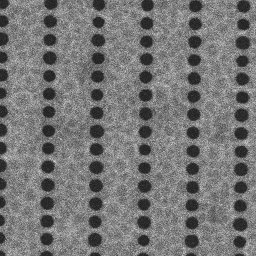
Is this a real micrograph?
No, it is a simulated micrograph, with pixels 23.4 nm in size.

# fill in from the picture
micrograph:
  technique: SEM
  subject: a regular array of holes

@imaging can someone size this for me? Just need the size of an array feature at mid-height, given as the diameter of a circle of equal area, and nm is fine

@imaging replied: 309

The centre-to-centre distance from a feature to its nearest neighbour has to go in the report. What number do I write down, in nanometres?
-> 422